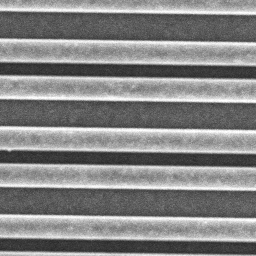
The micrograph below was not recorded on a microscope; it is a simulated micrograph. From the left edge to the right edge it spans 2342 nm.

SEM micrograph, parallel lines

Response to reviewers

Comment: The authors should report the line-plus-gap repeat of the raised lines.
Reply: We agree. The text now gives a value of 0.402 micrometres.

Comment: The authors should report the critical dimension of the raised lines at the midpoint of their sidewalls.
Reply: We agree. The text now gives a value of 205 nm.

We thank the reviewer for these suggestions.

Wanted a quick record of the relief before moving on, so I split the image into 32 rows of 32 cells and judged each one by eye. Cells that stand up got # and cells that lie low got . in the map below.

################################
................################
................................
................................
................................
################################
################################
################################
................................
................................
################################
################################
...................#############
................................
................................
................................
################################
################################
################################
................................
................................
################################
################################
......................##########
................................
................................
................................
################################
################################
################################
................................
................................